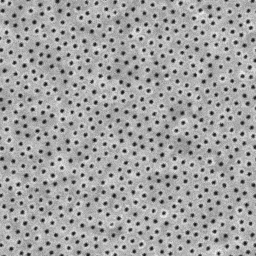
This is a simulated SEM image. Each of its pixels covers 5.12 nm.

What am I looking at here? a regular array of holes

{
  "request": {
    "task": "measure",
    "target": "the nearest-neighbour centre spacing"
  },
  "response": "47.3 nanometers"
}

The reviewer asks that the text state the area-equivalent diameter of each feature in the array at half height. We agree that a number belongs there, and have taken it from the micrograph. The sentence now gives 22.4 nanometres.